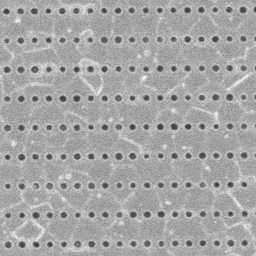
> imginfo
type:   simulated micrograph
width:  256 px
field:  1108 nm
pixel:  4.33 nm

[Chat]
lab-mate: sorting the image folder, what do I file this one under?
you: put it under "a regular array of holes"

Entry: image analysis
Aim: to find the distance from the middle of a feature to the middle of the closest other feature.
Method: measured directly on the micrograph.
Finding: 59.9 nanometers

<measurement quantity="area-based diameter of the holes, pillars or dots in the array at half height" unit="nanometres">30.1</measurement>